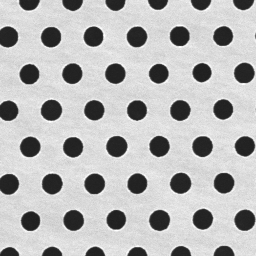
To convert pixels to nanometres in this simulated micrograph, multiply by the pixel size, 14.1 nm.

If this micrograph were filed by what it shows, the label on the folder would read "a regular array of holes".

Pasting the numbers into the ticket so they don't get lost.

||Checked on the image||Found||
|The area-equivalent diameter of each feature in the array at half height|295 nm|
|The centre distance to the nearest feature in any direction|596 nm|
